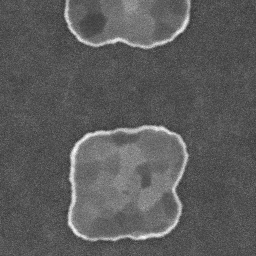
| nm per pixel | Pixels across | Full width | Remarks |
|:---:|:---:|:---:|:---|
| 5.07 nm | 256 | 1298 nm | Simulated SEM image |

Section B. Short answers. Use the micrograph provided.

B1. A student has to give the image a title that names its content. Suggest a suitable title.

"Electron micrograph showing raised bodies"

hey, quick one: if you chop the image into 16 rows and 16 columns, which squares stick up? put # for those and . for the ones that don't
....########....
....########....
.....######.....
................
................
................
................
................
.....######.....
.....#######....
....#######.....
....#######.....
.....######.....
....#######.....
.....#####......
................